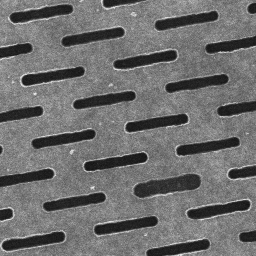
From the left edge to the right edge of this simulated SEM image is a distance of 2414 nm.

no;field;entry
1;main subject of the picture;a regular array of holes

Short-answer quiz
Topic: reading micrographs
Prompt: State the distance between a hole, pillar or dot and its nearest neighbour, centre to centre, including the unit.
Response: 532 nanometres